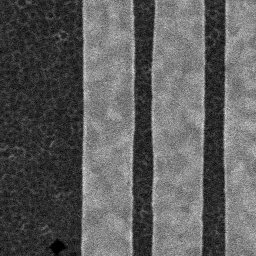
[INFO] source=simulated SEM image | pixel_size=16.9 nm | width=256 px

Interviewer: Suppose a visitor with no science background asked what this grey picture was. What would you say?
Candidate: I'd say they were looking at one or a few lines or trenches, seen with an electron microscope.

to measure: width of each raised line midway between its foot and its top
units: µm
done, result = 0.843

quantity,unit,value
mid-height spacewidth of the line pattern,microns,0.352